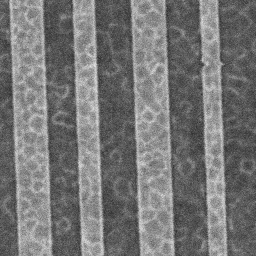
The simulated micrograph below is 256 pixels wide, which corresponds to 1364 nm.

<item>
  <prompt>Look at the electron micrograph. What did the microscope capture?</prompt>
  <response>one or a few lines or trenches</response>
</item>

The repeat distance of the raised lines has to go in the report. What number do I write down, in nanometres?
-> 324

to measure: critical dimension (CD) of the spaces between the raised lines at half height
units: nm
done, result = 194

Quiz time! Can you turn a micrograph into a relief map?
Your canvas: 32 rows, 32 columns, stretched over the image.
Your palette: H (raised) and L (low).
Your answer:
LHHHHLLLLHHHLLLLLHHHHLLLLHHLLLLL
LHHHHLLLLHHHLLLLLHHHHLLLLHHLLLLL
LHHHHLLLLHHHLLLLLHHHHLLLLHHLLLLL
LLHHHLLLLHHHLLLLLHHHHLLLLHHLLLLL
LLHHHLLLLHHHLLLLLHHHHLLLLHHLLLLL
LLHHHLLLLHHHLLLLLHHHHLLLLHHLLLLL
LLHHHLLLLHHHLLLLLHHHHLLLLHHLLLLL
LLHHHLLLLLHHLLLLLHHHHLLLLHHLLLLL
LLHHHHLLLLHHLLLLLHHHHLLLLLHLLLLL
LLHHHHLLLLHHLLLLLHHHHLLLLHHLLLLL
LLHHHHLLLLHHLLLLLHHHHLLLLLHLLLLL
LLHHHHLLLLHHLLLLLHHHHLLLLLHLLLLL
LLHHHHLLLLHHLLLLLHHHHLLLLLHHLLLL
LLHHHHLLLLHHLLLLLHHHHLLLLLHHLLLL
LLHHHHLLLLHHLLLLLHHHHLLLLLHHLLLL
LLHHHHLLLLHHLLLLLHHHHLLLLLHHLLLL
LLHHHHLLLLHHLLLLLHHHHLLLLLHHLLLL
LLHHHHLLLLHHLLLLLHHHHLLLLLHHLLLL
LLHHHHLLLLHHLLLLLHHHHLLLLLHHLLLL
LLHHHHLLLLHHLLLLLHHHHLLLLLHHLLLL
LLHHHHLLLLHHLLLLLHHHHLLLLLHHLLLL
LLHHHHLLLLHHLLLLLHHHHLLLLLHHLLLL
LLHHHHLLLLHHHLLLLHHHHLLLLLHHLLLL
LLHHHHLLLLHHHLLLLHHHHLLLLLHHLLLL
LLHHHHLLLLHHHLLLLHHHHLLLLLHHLLLL
LLHHHHLLLLHHHLLLLHHHHLLLLLHHLLLL
LLHHHHLLLLHHHLLLLLHHHLLLLLHHLLLL
LLHHHHLLLLHHHLLLLLHHHLLLLLHHLLLL
LLHHHHLLLLHHHLLLLLHHHHLLLLHHLLLL
LLHHHHLLLLHHHLLLLLHHHHLLLLHHLLLL
LLLHHHLLLLHHHLLLLLHHHHLLLLHHLLLL
LLLHHHLLLLHHHLLLLLHHHHLLLLHHLLLL